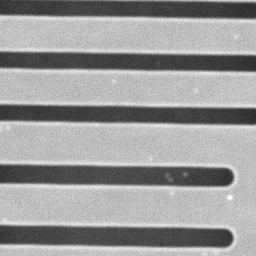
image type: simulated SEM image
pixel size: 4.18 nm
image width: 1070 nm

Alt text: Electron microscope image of groups of lines, slits or small figures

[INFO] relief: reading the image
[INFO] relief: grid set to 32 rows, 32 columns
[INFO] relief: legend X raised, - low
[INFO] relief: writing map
--------------------------------
--------------------------------
XXXXXXXXXXXXXXXXXXXXXXXXXXXXXXXX
XXXXXXXXXXXXXXXXXXXXXXXXXXXXXXXX
XXXXXXXXXXXXXXXXXXXXXXXXXXXXXXXX
XXXXXXXXXXXXXXXXXXXXXXXXXXXXXXXX
----------------XXXXXXXXXXXXXXXX
--------------------------------
--------------------------------
XXXXXXXXXXXXXXXXXXXXXXXXXXXXXXXX
XXXXXXXXXXXXXXXXXXXXXXXXXXXXXXXX
XXXXXXXXXXXXXXXXXXXXXXXXXXXXXXXX
XXXXXXXXXXXXXXXXXXXXXXXXXXXXXXXX
--------------------------------
--------------------------------
XXXXXXXXXXXXXXXXXX--------------
XXXXXXXXXXXXXXXXXXXXXXXXXXXXXXXX
XXXXXXXXXXXXXXXXXXXXXXXXXXXXXXXX
XXXXXXXXXXXXXXXXXXXXXXXXXXXXXXXX
XXXXXXXXXXXXXXXXXXXXXXXXXXXXXXXX
---------XXXXXXXXXXXXXXXXXXXXXXX
-----------------------------XXX
-----------------------------XXX
XXXXXXXXXXXXXXXXXXXXXXXXXXXXXXXX
XXXXXXXXXXXXXXXXXXXXXXXXXXXXXXXX
XXXXXXXXXXXXXXXXXXXXXXXXXXXXXXXX
XXXXXXXXXXXXXXXXXXXXXXXXXXXXXXXX
XXXXXXXXXXXXXXXXXXXXXXXXXXXXXXXX
--------------------------XXXXXX
-----------------------------XXX
-----------------------------XXX
XXXXXXXXXXXXXXXXXXXXXXXXXXXXXXXX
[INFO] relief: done